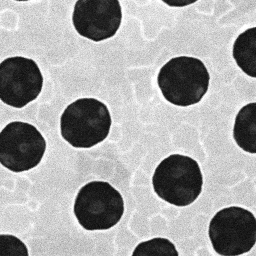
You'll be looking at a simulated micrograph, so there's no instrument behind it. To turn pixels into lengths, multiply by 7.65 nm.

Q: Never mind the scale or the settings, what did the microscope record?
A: holes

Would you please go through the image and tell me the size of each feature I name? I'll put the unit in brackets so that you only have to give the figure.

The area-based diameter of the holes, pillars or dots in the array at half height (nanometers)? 390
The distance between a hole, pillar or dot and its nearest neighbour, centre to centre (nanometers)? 642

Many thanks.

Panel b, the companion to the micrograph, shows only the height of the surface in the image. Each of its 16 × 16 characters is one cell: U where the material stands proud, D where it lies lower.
UUUUUDDDUUUUUUUU
UUUUUDDDUUUUUUUU
UUUUUUUUUUUUUUUD
UUUUUUUUUUUUUUUD
DDDUUUUUUUDDDUUD
DDDUUUUUUUDDDUUU
DDUUDDUUUUUDUUUU
UUUUDDDUUUUUUUUD
DDDUDDDUUUUUUUUD
DDDUUUUUUUUUUUUU
DDUUUUUUUUDDUUUU
UUUUUDDUUUDDDUUU
UUUUUDDDUUDDUUUU
UUUUUDDDUUUUUDDD
UUUUUUUUUUUUUDDD
DDUUUUUUUDDUUDDD